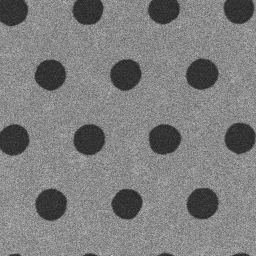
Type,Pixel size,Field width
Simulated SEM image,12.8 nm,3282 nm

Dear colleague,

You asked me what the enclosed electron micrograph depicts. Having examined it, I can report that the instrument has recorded a regular array of holes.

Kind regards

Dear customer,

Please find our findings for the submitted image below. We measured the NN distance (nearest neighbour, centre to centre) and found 958 nm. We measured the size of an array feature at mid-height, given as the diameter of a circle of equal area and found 0.4 microns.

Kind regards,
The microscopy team